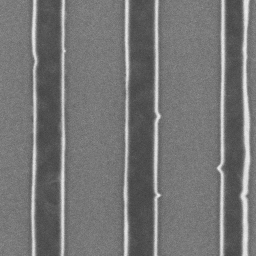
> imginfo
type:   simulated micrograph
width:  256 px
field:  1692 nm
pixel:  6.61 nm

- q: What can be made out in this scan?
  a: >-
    one or a few lines or trenches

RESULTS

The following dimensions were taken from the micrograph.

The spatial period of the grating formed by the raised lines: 613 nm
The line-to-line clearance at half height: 423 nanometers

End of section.